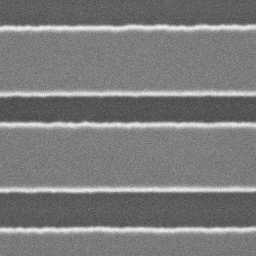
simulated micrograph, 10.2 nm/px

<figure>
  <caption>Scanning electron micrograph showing lines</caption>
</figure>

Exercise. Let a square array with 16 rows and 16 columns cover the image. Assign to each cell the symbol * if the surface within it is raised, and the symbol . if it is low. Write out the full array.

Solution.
................
................
****************
****************
****************
****************
................
................
****************
****************
****************
****************
................
................
****************
****************